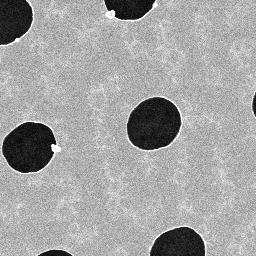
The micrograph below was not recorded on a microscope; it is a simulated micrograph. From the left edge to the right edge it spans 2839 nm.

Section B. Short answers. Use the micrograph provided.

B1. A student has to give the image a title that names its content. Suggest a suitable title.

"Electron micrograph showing holes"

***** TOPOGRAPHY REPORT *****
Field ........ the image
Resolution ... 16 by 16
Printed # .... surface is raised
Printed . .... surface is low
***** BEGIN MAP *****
..#####..#######
..##############
.###############
################
################
################
#########..#####
########...#####
...#####...#####
...#############
#..#############
################
################
################
##########..####
#########....###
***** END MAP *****